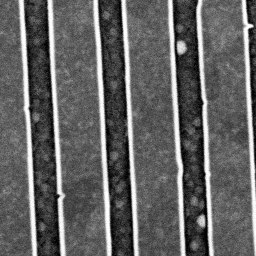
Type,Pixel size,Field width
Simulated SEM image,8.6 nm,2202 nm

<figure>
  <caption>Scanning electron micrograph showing one or a few lines or trenches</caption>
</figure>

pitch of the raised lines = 637 nanometers